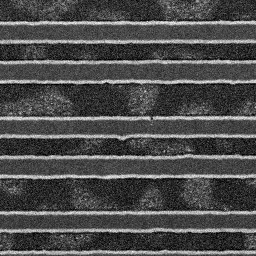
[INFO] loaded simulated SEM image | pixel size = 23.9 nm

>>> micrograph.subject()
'parallel lines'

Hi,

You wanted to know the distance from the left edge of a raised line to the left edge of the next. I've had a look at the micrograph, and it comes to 1130 nanometres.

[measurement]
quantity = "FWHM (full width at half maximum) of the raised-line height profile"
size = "451 nm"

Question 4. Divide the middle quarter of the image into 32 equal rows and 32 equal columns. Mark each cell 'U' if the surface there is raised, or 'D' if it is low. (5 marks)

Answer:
UUUUUUUUUUUUUUUUUUUUUUUUUUUUUUUU
UUUUUUUUUUUUUUUUUUUUUUUUUUUUUUUU
UUUUUUUUUUUUUUUUUUUUUUUUUUUUUUUU
UUUUUUUUUUUUUUUUUUUUUUUUUUUUUUUU
DDUUDDDDUUDDDDDDDDDDDDDDDUUUDDDD
DDDDDDDDDDDDDDDDDDDDDDDDDDDDDDDD
DDDDDDDDDDDDDDDDDDDDDDDDDDDDDDDD
DDDDDDDDDDDDDDDDDDDDDDDDDDDDDDDD
DDDDDDDDDDDDDDDDDDDDDDDDDDDDDDDD
DDDDDDDDDDDDDDDDDDDDDDDDDDDDDDDD
DDDDDDDDDDDDDDDDDDDDDDDDDDDDDDDD
DDDDDDDDDDDDDDDDDDDDDDDDDDDDDDDD
DDDDDDDDDDDDDDDDDDDDDDDDDDDDDDDD
DDDDDDDDDDDDDDDDDDDDDDDDDDDDDDDD
UUUUUUUUUUUUUUUUUUUUUUUUUUUUUUUU
UUUUUUUUUUUUUUUUUUUUUUUUUUUUUUUU
UUUUUUUUUUUUUUUUUUUUUUUUUUUUUUUU
UUUUUUUUUUUUUUUUUUUUUUUUUUUUUUUU
DDDDDDDDDDDDDDDDDDDDDDDDDDDDDDDD
DDDDDDDDDDDDDDDDDDDDDDDDDDDDDDDD
DDDDDDDDDDDDDDDDDDDDDDDDDDDDDDDD
DDDDDDDDDDDDDDDDDDDDDDDDDDDDDDDD
DDDDDDDDDDDDDDDDDDDDDDDDDDDDDDDD
DDDDUUUUUDDDDDDUUDDDDDDDDDDDDUUU
UUUUUUUUUUUUUUUUUUUUUUUUUUUUUUUU
UUUUUUUUUUUUUUUUUUUUUUUUUUUUUUUU
UUUUUUUUUUUUUUUUUUUUUUUUUUUUUUUU
UUUUUUUUUUUUUUUUUUUUUUUUUUUUUUUU
DDDDDDDDDDDDDDDDDDDDDDDDDDDDDDDD
DDDDDDDDDDDDDDDDDDDDDDDDDDDDDDDD
DDDDDDDDDDDDDDDDDDDDDDDDDDDDDDDD
DDDDDDDDDDDDDDDDDDDDDDDDDDDDDDDD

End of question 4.